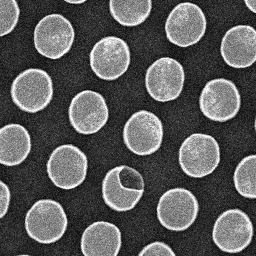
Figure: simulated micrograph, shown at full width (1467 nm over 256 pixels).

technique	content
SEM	a regular array of raised bodies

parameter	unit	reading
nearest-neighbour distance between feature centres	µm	0.334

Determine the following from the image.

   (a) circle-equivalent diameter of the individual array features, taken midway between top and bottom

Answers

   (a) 41 pixels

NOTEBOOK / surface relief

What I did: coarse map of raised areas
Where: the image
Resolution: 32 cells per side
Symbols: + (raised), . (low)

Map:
++............+++++....+.......+
++............+++++..++++.......
++...+++.......+++...+++++......
++..+++++............+++++...++.
....+++++............++++...++++
....+++++...++++......++....++++
.....+++...+++++............++++
...........+++++....++......++++
............++++...++++.........
..++++......+++...+++++.........
..++++............+++++...+++...
..+++++...++.......++++..+++++..
..++++...++++.......+....+++++..
...++....++++............+++++..
.........++++....++.......+++...
.........++++...++++............
+++.......++....++++............
++++............++++...++++.....
++++...+++......++++...++++.....
+++...+++++...........+++++....+
++....+++++............++++...++
......+++++...+........+++...+++
......++++...++..............+++
+.......+....+++..............++
+............+++++..++++.......+
+...+++.......+++...+++++.......
+...++++............+++++...++..
...+++++............++++...++++.
...+++++...++++......++....+++++
....++++..+++++............++++.
..........+++++....+.......++++.
..........+++++...++++..........